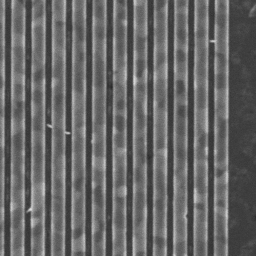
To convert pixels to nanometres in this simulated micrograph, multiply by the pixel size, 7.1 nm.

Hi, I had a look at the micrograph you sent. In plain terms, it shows parallel lines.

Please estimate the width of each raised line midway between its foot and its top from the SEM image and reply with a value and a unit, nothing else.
95 nm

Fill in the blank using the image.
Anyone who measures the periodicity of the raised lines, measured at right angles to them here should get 0.144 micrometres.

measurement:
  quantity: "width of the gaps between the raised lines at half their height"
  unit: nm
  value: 50.6